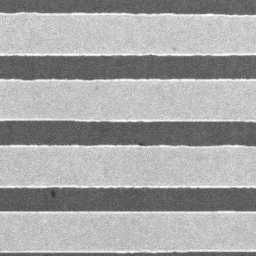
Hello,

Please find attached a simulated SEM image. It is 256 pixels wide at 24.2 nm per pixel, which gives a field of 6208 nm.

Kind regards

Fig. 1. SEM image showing lines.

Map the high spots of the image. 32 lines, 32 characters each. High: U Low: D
DDDDDDDDDDDDDDDDDDDDDDDDDDDDDDDD
DDDDDDDDDDDDDDDDDDDDDDDDDDDDDDDD
UUUUUUUUUUUUUUUUUUUUUUUUUUUUUUUU
UUUUUUUUUUUUUUUUUUUUUUUUUUUUUUUU
UUUUUUUUUUUUUUUUUUUUUUUUUUUUUUUU
UUUUUUUUUUUUUUUUUUUUUUUUUUUUUUUU
UUUUUUUUUUUUUUUUUUUUUUUUUUUUUUUU
DDDDDDDDDDDDDDDDDDDDDDDDDDDDDDDD
DDDDDDDDDDDDDDDDDDDDDDDDDDDDDDDD
DDDDDDDDDDDDDDDDDDDDDDDDDDDDDDDD
UUUUUUUUUUUUUUUUUUUUUUUUUUUUUUUU
UUUUUUUUUUUUUUUUUUUUUUUUUUUUUUUU
UUUUUUUUUUUUUUUUUUUUUUUUUUUUUUUU
UUUUUUUUUUUUUUUUUUUUUUUUUUUUUUUU
UUUUUUUUUUUUUUUUUUUUUUUUUUUUUUUU
DDDDDDDDDDDDDDDDDDDDDDDDDDDDDDDD
DDDDDDDDDDDDDDDDDDDDDDDDDDDDDDDD
DDDDDDDDDDDDDDDDDDDDDDDDDDDDDDDD
UUUUUUUUUUUUUUUUUUUUUUUUUUUUUUUU
UUUUUUUUUUUUUUUUUUUUUUUUUUUUUUUU
UUUUUUUUUUUUUUUUUUUUUUUUUUUUUUUU
UUUUUUUUUUUUUUUUUUUUUUUUUUUUUUUU
UUUUUUUUUUUUUUUUUUUUUUUUUUUUUUUU
DDDDDDDDDDDDDDDDDDDDDDDDDDDDDDDD
DDDDDDDDDDDDDDDDDDDDDDDDDDDDDDDD
DDDDDDDDDDDDDDDDDDDDDDDDDDDDDDDD
DDDDDDDDDDDDDDDDDDDDDDDDDDDDDDDD
UUUUUUUUUUUUUUUUUUUUUUUUUUUUUUUU
UUUUUUUUUUUUUUUUUUUUUUUUUUUUUUUU
UUUUUUUUUUUUUUUUUUUUUUUUUUUUUUUU
UUUUUUUUUUUUUUUUUUUUUUUUUUUUUUUU
DDDDDDDDDDDDDDDDDDDDDDDDDDDDDDDD